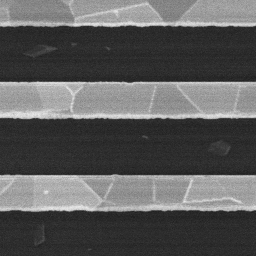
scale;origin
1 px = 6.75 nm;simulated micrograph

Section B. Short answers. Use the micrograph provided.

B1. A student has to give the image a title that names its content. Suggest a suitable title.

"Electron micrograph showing lines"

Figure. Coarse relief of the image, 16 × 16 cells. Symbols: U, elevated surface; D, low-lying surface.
UUUUUUUUUUUUUUUU
UUUUUUUUUUUUUUUU
DDDDDDDDDDDDDDDD
DDDDDDDDDDDDDDDD
DDDDDDDDDDDDDDDD
UUUUUUUUUUUUUUUU
UUUUUUUUUUUUUUUU
DDDDDDDDDDDDDDDD
DDDDDDDDDDDDDDDD
DDDDDDDDDDDDDDDD
DDDDDDDDDDDDDDDD
UUUUUUUUUUUUUUUU
UUUUUUUUUUUUUUUU
DDDDDDDDDDDDDDDD
DDDDDDDDDDDDDDDD
DDDDDDDDDDDDDDDD